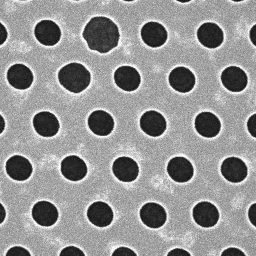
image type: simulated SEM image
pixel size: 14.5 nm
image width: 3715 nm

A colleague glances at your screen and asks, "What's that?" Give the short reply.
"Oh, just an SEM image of a regular array of holes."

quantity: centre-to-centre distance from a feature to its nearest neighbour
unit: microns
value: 0.751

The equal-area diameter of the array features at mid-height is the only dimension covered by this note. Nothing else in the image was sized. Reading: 0.389 microns